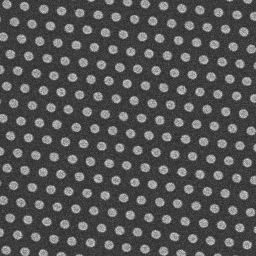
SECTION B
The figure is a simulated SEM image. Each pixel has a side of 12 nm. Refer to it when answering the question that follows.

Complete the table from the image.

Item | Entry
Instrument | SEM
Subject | a regular array of raised bodies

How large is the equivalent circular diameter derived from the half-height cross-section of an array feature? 108 nm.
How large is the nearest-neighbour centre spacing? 217 nm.